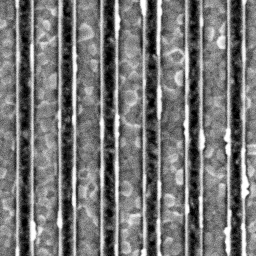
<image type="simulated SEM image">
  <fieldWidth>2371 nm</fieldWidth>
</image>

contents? parallel lines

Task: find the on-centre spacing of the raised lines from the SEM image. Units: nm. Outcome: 391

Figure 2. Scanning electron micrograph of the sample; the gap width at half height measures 25.6 px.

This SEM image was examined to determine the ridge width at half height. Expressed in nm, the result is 155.